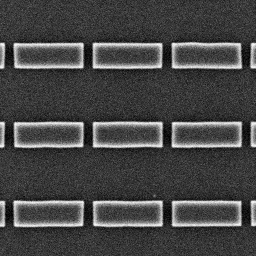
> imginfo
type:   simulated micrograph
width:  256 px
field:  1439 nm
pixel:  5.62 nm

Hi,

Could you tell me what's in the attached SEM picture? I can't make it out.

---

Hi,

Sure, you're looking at an array of small figures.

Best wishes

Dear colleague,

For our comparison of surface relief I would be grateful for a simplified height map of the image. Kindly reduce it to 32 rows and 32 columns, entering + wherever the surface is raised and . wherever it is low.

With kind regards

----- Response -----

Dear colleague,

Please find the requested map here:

................................
................................
................................
................................
................................
..+....+++..+++.+.....++++.+++..
..++++++++..++++++++..++++++++.+
..++++++++..++++++++..++++++++.+
................................
................................
................................
................................
................................
................................
................................
..++++++++..++++++++..++++++++..
+.++++++++..++++++++..++++++++.+
..++++++++..++++++++..++++++++.+
................................
................................
................................
................................
................................
................................
................................
..++++++++..++++++++..++++++++.+
+.++++++++..++++++++..++++++++.+
+.++++++++..++++++++..++++++++.+
................................
................................
................................
................................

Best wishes